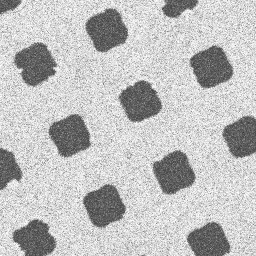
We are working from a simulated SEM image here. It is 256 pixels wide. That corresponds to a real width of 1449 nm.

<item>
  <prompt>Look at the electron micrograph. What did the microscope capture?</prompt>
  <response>holes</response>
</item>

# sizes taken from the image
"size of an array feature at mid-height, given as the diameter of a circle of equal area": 228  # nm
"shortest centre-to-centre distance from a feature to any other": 442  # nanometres